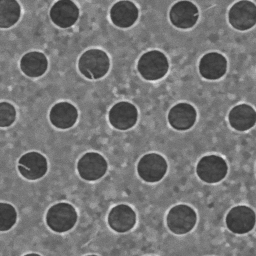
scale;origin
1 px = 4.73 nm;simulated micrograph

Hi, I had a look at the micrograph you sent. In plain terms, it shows a regular array of holes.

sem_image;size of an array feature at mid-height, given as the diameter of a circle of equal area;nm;143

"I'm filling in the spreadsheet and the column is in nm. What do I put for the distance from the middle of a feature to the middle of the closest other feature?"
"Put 277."